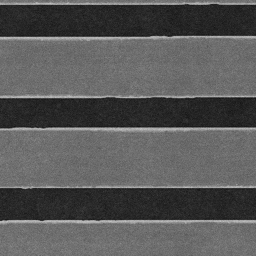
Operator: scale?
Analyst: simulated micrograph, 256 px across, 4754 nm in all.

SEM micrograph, lines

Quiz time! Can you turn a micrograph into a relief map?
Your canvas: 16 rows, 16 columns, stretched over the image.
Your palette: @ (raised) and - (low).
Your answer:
----------------
----------------
@@@@@@@@@@@@@@@@
@@@@@@@@@@@@@@@@
@@@@@@@@@@@@@@@@
@@@@@@@@@@@@@@@@
----------------
----------------
@@@@@@@@@@@@@@@@
@@@@@@@@@@@@@@@@
@@@@@@@@@@@@@@@@
@@@@@@@@@@@@@@@@
----------------
----------------
@@@@@@@@@@@@@@@@
@@@@@@@@@@@@@@@@